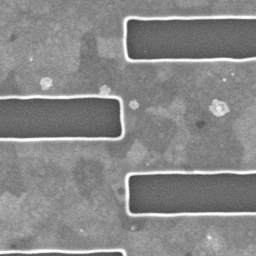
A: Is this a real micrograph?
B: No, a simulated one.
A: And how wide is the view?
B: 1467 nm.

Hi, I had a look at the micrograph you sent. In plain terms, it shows groups of lines, slits or small figures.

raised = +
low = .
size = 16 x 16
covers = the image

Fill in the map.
++++++++++++++++
++++++++........
++++++++........
++++++++........
++++++++++++++++
++++++++++++++++
.......+++++++++
........++++++++
.......+++++++++
++++++++++++++++
++++++++++++++++
++++++++........
++++++++........
++++++++++++++++
++++++++++++++++
++++++++++++++++